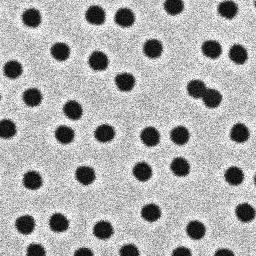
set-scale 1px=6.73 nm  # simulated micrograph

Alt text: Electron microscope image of a regular array of holes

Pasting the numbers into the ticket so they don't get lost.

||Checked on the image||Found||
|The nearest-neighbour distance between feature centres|229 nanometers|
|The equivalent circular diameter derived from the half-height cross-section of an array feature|137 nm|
